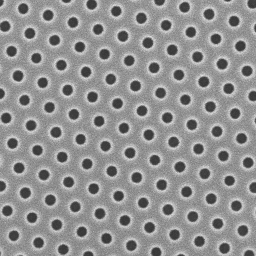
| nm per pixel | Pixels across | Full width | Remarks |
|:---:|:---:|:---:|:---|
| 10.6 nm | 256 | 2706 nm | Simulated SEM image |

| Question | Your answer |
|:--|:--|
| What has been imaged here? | a regular array of holes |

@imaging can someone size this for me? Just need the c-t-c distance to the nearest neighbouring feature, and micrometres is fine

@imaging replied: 0.269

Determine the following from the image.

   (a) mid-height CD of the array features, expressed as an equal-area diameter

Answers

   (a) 0.116 µm